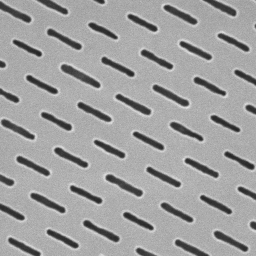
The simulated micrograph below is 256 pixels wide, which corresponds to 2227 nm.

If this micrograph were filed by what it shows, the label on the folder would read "a regular array of holes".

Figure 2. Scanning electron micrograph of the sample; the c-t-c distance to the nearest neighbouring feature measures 334 nm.